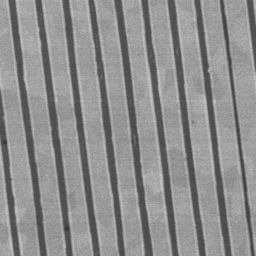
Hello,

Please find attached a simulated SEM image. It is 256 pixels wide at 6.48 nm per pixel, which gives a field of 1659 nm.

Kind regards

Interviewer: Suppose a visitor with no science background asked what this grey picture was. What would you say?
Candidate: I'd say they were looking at parallel lines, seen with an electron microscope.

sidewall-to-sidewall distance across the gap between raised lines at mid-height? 57 nanometers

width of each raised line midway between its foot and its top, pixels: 17.6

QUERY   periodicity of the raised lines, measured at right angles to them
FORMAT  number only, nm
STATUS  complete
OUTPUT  169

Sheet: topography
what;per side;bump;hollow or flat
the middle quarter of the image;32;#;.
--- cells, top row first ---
#...####..####...####..#####..##
#...####..#####..####..#####..##
#...####..#####..####...####..##
#...####...####..####...####..##
#...####...####..####...####..##
#...####...####..#####..####...#
##..#####..####..#####..####...#
##..#####..####..#####..####...#
##..#####..####...####..#####..#
##..#####..####...####..####...#
##..#####..####...####..#####..#
##...####...####..####...####..#
##...####...####..####...####..#
##...####...####..####...####..#
###..#####..####..#####..####..#
###..#####..####..#####..####...
###..#####..####...####..####...
###..#####..####...####..####...
###..#####..####...####..#####..
###...####...####..####...####..
###...####...####..####...####..
###...####...####..####...####..
####..####...####..#####..####..
####..####...####..#####..####..
####..####...####..#####..####..
####...####..####..#####..#####.
####...####..####...####..#####.
####...####..#####..####...####.
.####..####...####..####...####.
.####..####...####..####...####.
.####..####...####..#####..####.
.####..#####..####..#####..####.